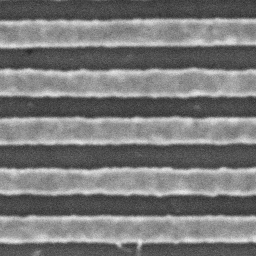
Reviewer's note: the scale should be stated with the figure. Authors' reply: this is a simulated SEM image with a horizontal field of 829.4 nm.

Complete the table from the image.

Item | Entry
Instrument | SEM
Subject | lines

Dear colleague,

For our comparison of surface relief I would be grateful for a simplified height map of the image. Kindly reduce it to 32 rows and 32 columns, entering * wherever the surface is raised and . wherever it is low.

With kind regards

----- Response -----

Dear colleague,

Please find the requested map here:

................................
................................
.................***************
********************************
********************************
********************************
................................
................................
................................
********************************
********************************
********************************
................................
................................
................................
********************************
********************************
********************************
................................
................................
................................
********************************
********************************
********************************
................................
................................
................................
********************************
********************************
********************************
................................
................................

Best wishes